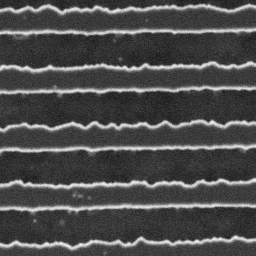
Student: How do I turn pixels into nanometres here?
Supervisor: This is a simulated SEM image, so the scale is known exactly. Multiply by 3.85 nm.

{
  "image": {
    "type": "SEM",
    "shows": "lines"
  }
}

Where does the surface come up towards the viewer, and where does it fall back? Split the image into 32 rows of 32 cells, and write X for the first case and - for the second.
--------------------------------
XXXXXXXXXXXXXXXXXXXXXXXXXXXXXXXX
XXXXXXXXXXXXXXXXXXXXXXXXXXXXXXXX
XXXXXXXXXXXXXXXXXXXXXXXXXXXXXXXX
--------------------------------
--------------------------------
--------------------------------
--------------------------------
XXXX--X--XXXXXXXXXXXXXXXXXXXXXXX
XXXXXXXXXXXXXXXXXXXXXXXXXXXXXXXX
XXXXXXXXXXXXXXXXXXXXXXXXXXXXXXXX
XXXXXXXXX---X-------------------
--------------------------------
--------------------------------
--------------------------------
--------XX-X---X-X--X--XXXX-XXXX
XXXXXXXXXXXXXXXXXXXXXXXXXXXXXXXX
XXXXXXXXXXXXXXXXXXXXXXXXXXXXXXXX
XXXXXXXXXXXXXXXXXXXXXXXXXXX---X-
--------------------------------
--------------------------------
--------------------------------
--------------------------------
XXXXXXXXXXXXXXXXXXXXXXXXXXXXXXXX
XXXXXXXXXXXXXXXXXXXXXXXXXXXXXXXX
XXXXXXXXXXXXXXXXXXXXXXXXXXXXXXXX
--------------------------------
--------------------------------
--------------------------------
--------------------------------
-XX--XXX--XXXXXXXXXXXXXXXXXXXXXX
XXXXXXXXXXXXXXXXXXXXXXXXXXXXXXXX